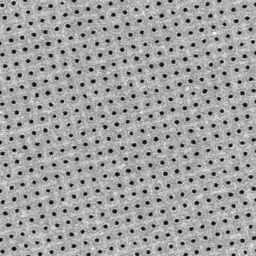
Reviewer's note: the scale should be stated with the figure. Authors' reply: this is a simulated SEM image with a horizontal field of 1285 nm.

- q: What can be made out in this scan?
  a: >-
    a regular array of holes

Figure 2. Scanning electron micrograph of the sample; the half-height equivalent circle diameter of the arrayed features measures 23.3 nm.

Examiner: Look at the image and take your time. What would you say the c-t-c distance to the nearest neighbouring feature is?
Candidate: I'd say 11.4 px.